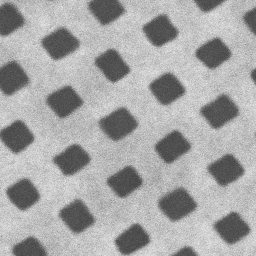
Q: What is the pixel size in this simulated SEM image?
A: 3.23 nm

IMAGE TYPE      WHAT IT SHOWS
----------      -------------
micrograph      a regular array of holes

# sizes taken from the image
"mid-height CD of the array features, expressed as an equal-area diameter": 96.5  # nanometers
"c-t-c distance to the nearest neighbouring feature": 187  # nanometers